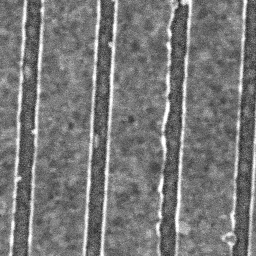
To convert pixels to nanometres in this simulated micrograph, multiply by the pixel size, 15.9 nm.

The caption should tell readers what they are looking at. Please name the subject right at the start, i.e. one or a few lines or trenches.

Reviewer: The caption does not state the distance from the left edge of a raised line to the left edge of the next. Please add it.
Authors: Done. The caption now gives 1160 nanometers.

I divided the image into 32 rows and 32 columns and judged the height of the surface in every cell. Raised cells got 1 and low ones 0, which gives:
11100111111100011111110011111110
11100111111100111111110011111110
11100111111100111111100011111100
11100111111100111111100011111100
11100111111100111111100111111100
11100111111100111111100011111100
11100111111100111111100111111100
11100111111100111111100111111100
11100111111100111111100111111100
11100111111100111111100111111100
11100111111100111111100111111100
11100111111100111111100111111100
11100111111100111111100111111100
11000111111100111111100111111100
11001111111100111111100111111100
11001111111000111111000111111100
11000111111000111111000111111100
11001111111000111111000111111100
11000111111000111111100111111100
11001111111001111111100111111100
11001111111001111111100111111100
11001111111001111111000111111100
11001111111001111111001111111000
11001111111001111111001111111000
11001111111001111111001111111000
11001111111001111111001111111001
11001111111001111111001111111001
11001111111001111111001111111001
11001111111001111111001111111001
11001111111001111111001111111001
10001111111001111111001111111001
10001111111001111111001111111001